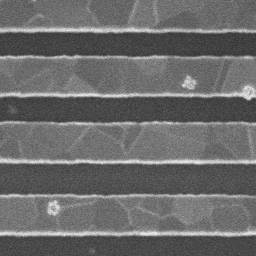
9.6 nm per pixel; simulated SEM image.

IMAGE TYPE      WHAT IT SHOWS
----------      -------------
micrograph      lines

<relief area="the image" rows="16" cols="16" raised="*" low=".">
****************
****************
................
.*..............
****************
****************
................
................
****************
****************
................
................
****************
****************
****************
................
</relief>